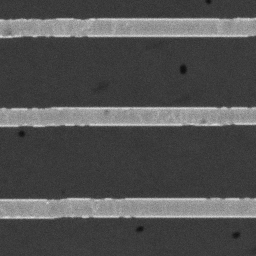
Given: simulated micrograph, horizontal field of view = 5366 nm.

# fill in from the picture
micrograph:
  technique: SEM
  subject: lines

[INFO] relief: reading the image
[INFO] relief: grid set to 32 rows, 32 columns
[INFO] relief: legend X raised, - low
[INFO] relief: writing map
--------------------------------
--------------------------------
-XXXX-XXXXXXXXXXXXXXXXXXXXXXXXXX
XXXXXXXXXXXXXXXXXXXXXXXXXXXXXXXX
XXX--XX--XX---------------------
--------------------------------
--------------------------------
--------------------------------
--------------------------------
--------------------------------
--------------------------------
--------------------------------
--------------------------------
----------------------------X--X
XXXXXXXXXXXXXXXXXXXXXXXXXXXXXXXX
XXXXXXXXXXXXXXXXXXXXXXXXXXXXX---
--------------------------------
--------------------------------
--------------------------------
--------------------------------
--------------------------------
--------------------------------
--------------------------------
--------------------------------
--------------------------------
XXXXXXXXXXXXXXXXXXXXXXXXXXXXXXXX
XXXXXXXXXXXXXXXXXXXXXXXXXXXXXXXX
--------------------------------
--------------------------------
--------------------------------
--------------------------------
--------------------------------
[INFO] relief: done